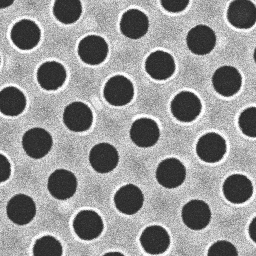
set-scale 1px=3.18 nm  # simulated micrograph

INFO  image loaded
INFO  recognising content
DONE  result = a regular array of holes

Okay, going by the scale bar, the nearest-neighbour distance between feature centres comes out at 154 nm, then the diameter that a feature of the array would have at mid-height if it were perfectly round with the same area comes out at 96.9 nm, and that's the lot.